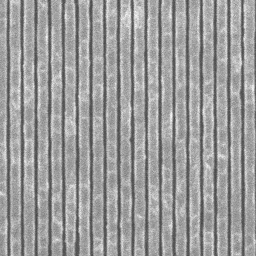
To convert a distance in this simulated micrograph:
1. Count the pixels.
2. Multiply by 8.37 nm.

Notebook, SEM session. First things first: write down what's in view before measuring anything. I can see parallel lines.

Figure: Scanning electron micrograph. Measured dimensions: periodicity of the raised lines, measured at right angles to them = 115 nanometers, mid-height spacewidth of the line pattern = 35.6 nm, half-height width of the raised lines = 84.8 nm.